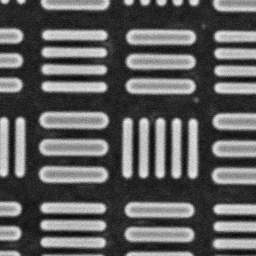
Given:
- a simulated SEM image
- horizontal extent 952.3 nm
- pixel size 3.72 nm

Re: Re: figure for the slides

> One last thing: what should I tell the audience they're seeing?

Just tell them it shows groups of lines, slits or small figures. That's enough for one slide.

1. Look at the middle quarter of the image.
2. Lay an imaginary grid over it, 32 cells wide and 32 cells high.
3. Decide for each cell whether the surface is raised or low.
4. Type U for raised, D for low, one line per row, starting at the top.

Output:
UDDDDDDDDDDDDDDDUUUUUUUUUUUUUUUU
UUUUUUUUUUDDDDDDDDDDDDDDDDDDDDDD
DDDDDDDDDDDDDDDDDDDDDDDDDDDDDDDD
DDDDDDDDDDDDDDDDDDDDDDDDDDDDDDDD
DDDDDDDDDDDDDDDDUUUUUUUUUUUUUUUU
UUUUUUUUUUUDDDDDUUUUUUUUUUUUUUUU
UUUUUUUUUUDDDDDDUUUUUUUUUUUUUUUU
DDDDDDDDDDDDDDDDDDDDDDDDDDDDDDDD
DDDDDDDDDDDDDDDDDDDDDDDDDDDDDDDD
DDDDDDDDDDDDDDDDDDDDDDDDDDDDDDDD
DDDDDDDDDDDDDDDDDDDDDDDDDDDDDDDD
DDDDDDDDDDDDDDDDDDDDDDDDDDDDDDDD
UUUUUUUUUUDDDDDDDDDDDDDDDDDDDDDD
UUUUUUUUUUUDDDDDDDDDDDDDDDDDDDDD
UUUUUUUUUUUDDDDUUDDUUDDUUDDUUDDD
UUUUUUUUUUDDDDDUUDDUUDDUUDDUUDDU
DDDDDDDDDDDDDDDUUDDUUDDUUDDUUDDU
DDDDDDDDDDDDDDDUUDDUUDDUUDDUUDDU
DDDDDDDDDDDDDDDUUDDUUDDUUDDUUDDU
UUUUUUUUUUDDDDDUUDDUUDDUUDDUUDDU
UUUUUUUUUUUDDDDUUDDUUDDUUDDUUDDU
UUUUUUUUUUUDDDDUUDDUUDDUUDDUUDDU
UUUUUUUUUUDDDDDUUDDUUDDUUDDUUDDU
DDDDDDDDDDDDDDDUUDDUUDDUUDDUUDDU
DDDDDDDDDDDDDDDUUDDUUDDUUDDUUDDU
DDDDDDDDDDDDDDDUUDDUUDDUUDDUUDDU
UUUUUUUUUUDDDDDUUDDUUDDUUDDUUDDU
UUUUUUUUUUUDDDDUUDDUUDDUUDDUUDDU
UUUUUUUUUUUDDDDDDDDDDDDDDDDDDDDD
DDDDDDDDDDDDDDDDDDDDDDDDDDDDDDDD
DDDDDDDDDDDDDDDDDDDDDDDDDDDDDDDD
DDDDDDDDDDDDDDDDDDDDDDDDDDDDDDDD